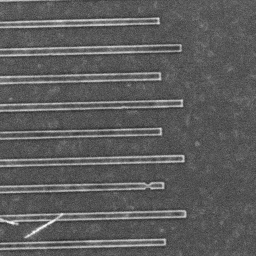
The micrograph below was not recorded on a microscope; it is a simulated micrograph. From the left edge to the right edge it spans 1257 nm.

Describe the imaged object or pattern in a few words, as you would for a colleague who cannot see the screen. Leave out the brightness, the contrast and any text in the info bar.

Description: parallel lines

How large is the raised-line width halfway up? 30.1 nm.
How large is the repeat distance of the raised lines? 136 nanometres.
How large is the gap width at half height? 104 nanometers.